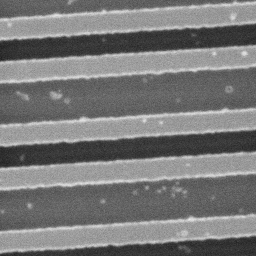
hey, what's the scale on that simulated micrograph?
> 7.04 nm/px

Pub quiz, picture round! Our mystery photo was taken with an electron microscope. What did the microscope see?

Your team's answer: lines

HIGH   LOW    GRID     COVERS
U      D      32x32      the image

DDDDDDDDDDDDDDDDDDDDDDDDDDDDDUUU
DDDDDDDDDDDDDDUUUUUUUUUUUUUUUUUU
UUUUUUUUUUUUUUUUUUUUUUUUUUUUUUUU
UUUUUUUUUUUUUUUUUUUUUUUDDDDDDDDD
UUUUUUUUDDDDDDDDDDDDDDDDDDDDDDDD
DDDDDDDDDDDDDDDDDDDDDDDDDDDDDDDD
DDDDDDDDDDDDDDDDDDDDUUUUUUUUUUUU
DDDDUUUUUUUUUUUUUUUUUUUUUUUUUUUU
UUUUUUUUUUUUUUUUUUUUUUUUUUUUUDDD
UUUUUUUUUUUUUUDDDDDDDDDDDDDDDDDD
DDDDDDDDDDDDDDDDDDDDDDDDDDDDDDDD
DDDDDDDDDDDDDDDDDDDDDDDDDDDDDDDD
DDDDDDDDDDDDDDDDDDDDDDDDDDDDDDDD
DDDDDDDDDDDDDDDDDDDDDDDDDDDDDDDD
DDDDDDDDDDDDDDDDDDUUUUUUUUUUUUUU
DDDUUUUUUUUUUUUUUUUUUUUUUUUUUUUU
UUUUUUUUUUUUUUUUUUUUUUUUUUDDDDDD
UUUUUUUUUUUUDDDDDDDDDDDDDDDDDDDD
DDDDDDDDDDDDDDDDDDDDDDDDDDDDDDDD
DDDDDDDDDDDDDDDDDDDDDDDDUUUUUUUU
DDDDDDDDDUUUUUUUUUUUUUUUUUUUUUUU
UUUUUUUUUUUUUUUUUUUUUUUUUUUUUUUU
UUUUUUUUUUUUUUUUUUDDDDDDDDDDDDDD
UUUDDDDDDDDDDDDDDDDDDDDDDDDDDDDD
DDDDDDDDDDDDDDDDDDDDDDDDDDDDDDDD
DDDDDDDDDDDDDDDDDDDDDDDDDDDDDDDD
DDDDDDDDDDDDDDDDDDDDDDDDDDDDDDDD
DDDDDDDDDDDDDDDDDDDDDDUUUUUUUUUU
DDDDDDDUUUUUUUUUUUUUUUUUUUUUUUUU
UUUUUUUUUUUUUUUUUUUUUUUUUUUUUUUD
UUUUUUUUUUUUUUUUDDDDDDDDDDDDDDDD
UDDDDDDDDDDDDDDDDDDDDDDDDDDDDDDD